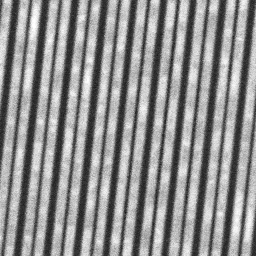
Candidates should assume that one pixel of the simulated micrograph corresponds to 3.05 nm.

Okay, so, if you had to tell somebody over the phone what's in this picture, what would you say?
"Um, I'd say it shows parallel lines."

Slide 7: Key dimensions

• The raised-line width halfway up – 7.84 px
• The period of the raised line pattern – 0.0448 um